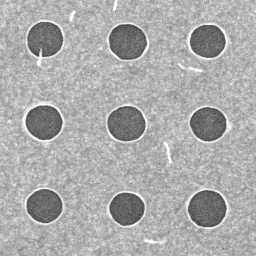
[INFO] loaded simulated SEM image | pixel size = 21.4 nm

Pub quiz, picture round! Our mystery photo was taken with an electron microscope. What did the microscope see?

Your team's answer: a regular array of holes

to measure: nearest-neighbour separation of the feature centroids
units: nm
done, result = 1740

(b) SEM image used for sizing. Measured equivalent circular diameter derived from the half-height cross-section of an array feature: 782 nm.